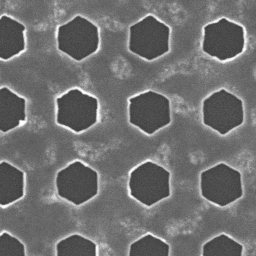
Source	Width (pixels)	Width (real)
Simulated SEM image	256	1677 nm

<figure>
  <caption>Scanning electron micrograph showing a regular array of holes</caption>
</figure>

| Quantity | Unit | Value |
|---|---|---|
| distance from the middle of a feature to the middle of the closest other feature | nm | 470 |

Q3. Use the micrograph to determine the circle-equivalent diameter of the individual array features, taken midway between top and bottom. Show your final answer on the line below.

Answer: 274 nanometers